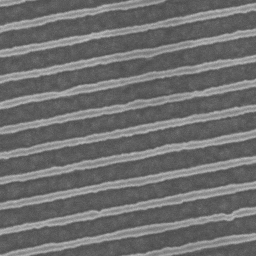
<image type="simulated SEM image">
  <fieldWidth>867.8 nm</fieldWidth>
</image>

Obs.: parallel lines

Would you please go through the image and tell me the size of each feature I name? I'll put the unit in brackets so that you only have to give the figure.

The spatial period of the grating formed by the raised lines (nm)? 84.8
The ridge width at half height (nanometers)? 21.2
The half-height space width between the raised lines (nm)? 64.2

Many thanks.